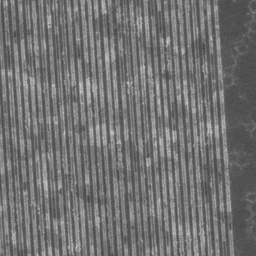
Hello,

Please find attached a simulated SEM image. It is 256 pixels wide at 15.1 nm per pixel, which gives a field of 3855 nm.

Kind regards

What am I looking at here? parallel lines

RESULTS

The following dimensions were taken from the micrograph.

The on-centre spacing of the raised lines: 105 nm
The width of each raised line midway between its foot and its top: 52.6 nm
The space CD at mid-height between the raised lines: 54.5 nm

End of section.